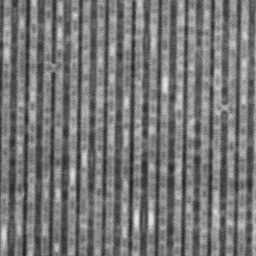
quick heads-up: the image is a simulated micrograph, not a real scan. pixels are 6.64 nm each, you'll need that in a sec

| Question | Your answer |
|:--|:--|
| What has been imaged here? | parallel lines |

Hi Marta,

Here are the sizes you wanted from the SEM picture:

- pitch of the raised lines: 87.7 nm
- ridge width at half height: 45.7 nm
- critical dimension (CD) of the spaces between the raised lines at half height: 50.7 nanometers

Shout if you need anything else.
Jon